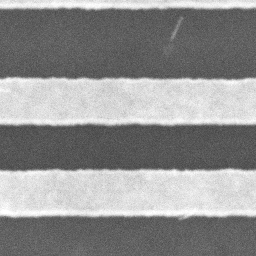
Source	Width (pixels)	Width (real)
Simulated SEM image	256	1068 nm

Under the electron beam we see lines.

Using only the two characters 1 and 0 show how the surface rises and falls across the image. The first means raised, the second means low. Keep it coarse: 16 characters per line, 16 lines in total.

0000000000000000
0000000000000000
0000000000000000
0000000000000000
0000000000000000
1111111111111111
1111111111111111
1111111111111111
0000000000000000
0000000000000000
0000000000000000
1111111111111111
1111111111111111
0000000000000000
0000000000000000
0000000000000000